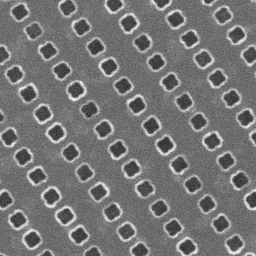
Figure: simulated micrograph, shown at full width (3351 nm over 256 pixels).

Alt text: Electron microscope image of a regular array of holes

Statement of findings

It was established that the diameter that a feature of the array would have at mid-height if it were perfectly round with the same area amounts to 200 nanometers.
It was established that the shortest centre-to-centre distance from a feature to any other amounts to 313 nanometres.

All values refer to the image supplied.